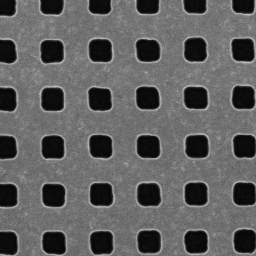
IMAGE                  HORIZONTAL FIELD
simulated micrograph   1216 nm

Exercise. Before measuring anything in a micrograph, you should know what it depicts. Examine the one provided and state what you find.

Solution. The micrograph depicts a regular array of holes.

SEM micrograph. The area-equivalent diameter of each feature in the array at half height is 113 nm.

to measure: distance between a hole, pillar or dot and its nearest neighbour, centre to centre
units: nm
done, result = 225